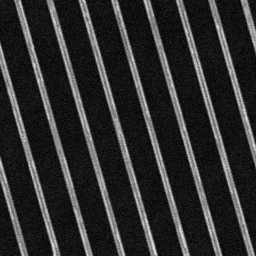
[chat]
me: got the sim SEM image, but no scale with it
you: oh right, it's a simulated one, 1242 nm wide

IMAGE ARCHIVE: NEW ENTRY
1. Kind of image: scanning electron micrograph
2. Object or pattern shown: parallel lines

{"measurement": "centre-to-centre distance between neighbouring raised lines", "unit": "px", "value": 31.1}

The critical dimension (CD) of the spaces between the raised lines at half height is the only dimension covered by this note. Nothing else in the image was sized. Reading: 25.5 pixels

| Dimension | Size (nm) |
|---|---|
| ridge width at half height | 28.5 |